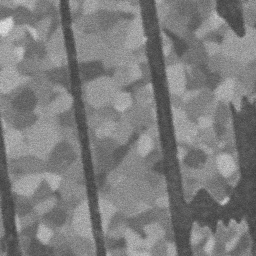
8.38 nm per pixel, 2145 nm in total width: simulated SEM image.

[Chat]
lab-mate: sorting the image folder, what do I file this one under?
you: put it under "one or a few lines or trenches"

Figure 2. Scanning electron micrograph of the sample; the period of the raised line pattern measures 680 nanometers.